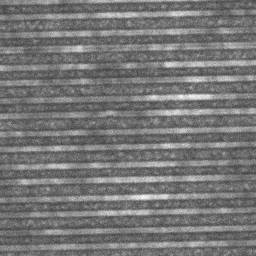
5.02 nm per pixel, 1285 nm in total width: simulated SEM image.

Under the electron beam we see parallel lines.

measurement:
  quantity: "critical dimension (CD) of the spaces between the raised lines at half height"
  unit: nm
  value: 58.4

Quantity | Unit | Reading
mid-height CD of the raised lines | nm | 19.5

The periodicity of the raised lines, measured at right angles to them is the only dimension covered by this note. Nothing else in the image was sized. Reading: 82.8 nm